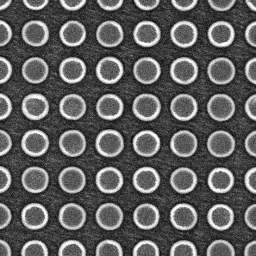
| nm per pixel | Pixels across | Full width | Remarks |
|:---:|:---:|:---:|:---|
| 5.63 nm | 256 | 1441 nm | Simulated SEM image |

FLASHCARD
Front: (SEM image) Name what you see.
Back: a regular array of raised bodies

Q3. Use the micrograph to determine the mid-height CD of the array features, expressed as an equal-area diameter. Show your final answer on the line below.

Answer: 142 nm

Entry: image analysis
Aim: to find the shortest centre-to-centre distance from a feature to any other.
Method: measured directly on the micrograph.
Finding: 205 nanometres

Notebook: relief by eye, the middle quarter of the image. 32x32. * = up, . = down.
*****...******....******...*****
*****...*******...******...*****
*****...*******...******...*****
****.....*****....*****....*****
.**.......***......***.......***
................................
................................
................................
****.....****.....*****.....****
*****....*****....******...*****
*****...*******..*******...*****
*****...*******..*******...*****
*****....*****....*****....*****
.**.......***......***......***.
................................
................................
................................
****.....*****.....****.....****
*****...******....*****....*****
*****...*******..*******...*****
*****...*******..*******...*****
*****....*****....*****....*****
.***......***......***......****
................................
................................
................................
****.....****......***.......**.
*****....*****....*****....*****
*****...******....******...*****
*****...******....******...*****
*****....*****....*****....*****
****.....****......***......****